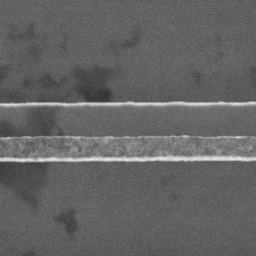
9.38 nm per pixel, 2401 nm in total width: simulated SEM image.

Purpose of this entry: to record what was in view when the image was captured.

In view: lines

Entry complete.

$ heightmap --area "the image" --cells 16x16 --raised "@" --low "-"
----------------
----------------
----------------
----------------
----------------
----------------
--@@-@@@@@@@-@@@
@@@@@@@@@@@@@@@@
@@@@@@@@@@@@@@@@
@@@@@@@@@@@@@@@@
----------------
----------------
----------------
----------------
----------------
----------------